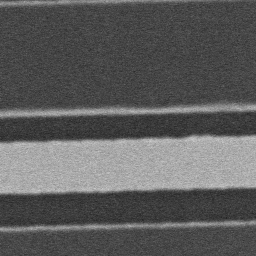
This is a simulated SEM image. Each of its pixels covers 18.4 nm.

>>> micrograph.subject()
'lines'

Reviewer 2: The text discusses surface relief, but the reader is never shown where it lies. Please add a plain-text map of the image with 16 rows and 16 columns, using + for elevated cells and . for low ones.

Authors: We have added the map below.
++++++++++++++++
++++++++++++++++
++++++++++++++++
++++++++++++++++
++++++++++++++++
++++++++++++++++
++++++++++++++++
................
................
++++++++++++++++
++++++++++++++++
++++++++++++++++
................
................
++++++++++++++++
++++++++++++++++